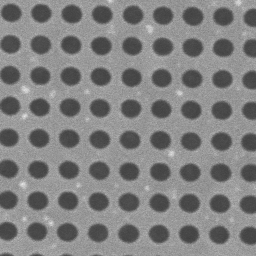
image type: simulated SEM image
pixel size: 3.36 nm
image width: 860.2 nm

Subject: a regular array of holes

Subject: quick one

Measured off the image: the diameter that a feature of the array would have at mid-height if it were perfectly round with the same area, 68.4 nm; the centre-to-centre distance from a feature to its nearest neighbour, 102 nanometers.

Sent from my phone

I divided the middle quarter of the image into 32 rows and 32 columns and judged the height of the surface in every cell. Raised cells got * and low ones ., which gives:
********************************
....***....****...*****...*****.
....***.....**.....***.....***..
....***.....**......**.....**...
....***.....**.....***.....**...
**.*****..******..*****...****..
********************************
********************************
*.******************************
....***....****....****...****..
....**.....***.....***.....**...
....**......**.....***.....**...
....***....***.....***.....**...
****************..******..****..
********************************
********************************
..******.***********************
...****....***.....***....****..
....**......**.....**......**...
....**......**.....**......**...
...****....****....***.....**...
************************.******.
********************************
********************************
...*****..******.***************
....**.....***....****....****..
....**......**.....**......**...
....**.....***.....**......**...
...****....****...****....***...
************************.******.
********************************
********************************